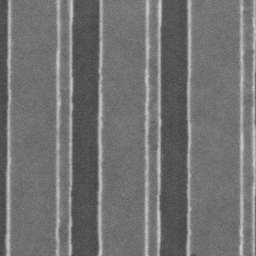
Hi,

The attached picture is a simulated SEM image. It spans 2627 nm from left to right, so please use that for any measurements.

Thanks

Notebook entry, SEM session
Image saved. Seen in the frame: lines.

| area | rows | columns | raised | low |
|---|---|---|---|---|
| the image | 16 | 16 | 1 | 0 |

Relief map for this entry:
0111001111001111
0111001111001111
0111001111001111
0111001111001111
0111001111001111
0111001111001111
0111001111001111
0111001111001111
0111001111001111
0111001111001111
0111001111001111
0111001111001111
0111001111001111
0111001111001111
0111001111001111
0111001111001111